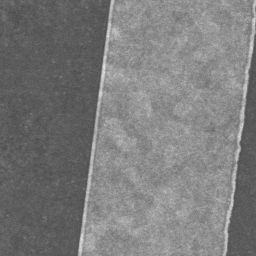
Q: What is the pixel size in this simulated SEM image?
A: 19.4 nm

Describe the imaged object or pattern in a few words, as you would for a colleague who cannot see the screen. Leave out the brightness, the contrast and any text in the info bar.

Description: one or a few lines or trenches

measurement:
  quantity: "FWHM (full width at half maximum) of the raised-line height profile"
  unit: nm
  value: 2790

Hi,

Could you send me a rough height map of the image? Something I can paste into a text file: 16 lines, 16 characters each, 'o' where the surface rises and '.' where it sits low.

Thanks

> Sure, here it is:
.......ooooooooo
.......ooooooooo
.......ooooooooo
.......ooooooooo
......ooooooooo.
......ooooooooo.
......ooooooooo.
......ooooooooo.
......ooooooooo.
......ooooooooo.
......ooooooooo.
......ooooooooo.
.....oooooooooo.
.....ooooooooo..
.....ooooooooo..
.....ooooooooo..